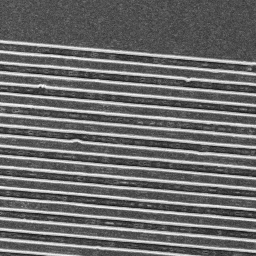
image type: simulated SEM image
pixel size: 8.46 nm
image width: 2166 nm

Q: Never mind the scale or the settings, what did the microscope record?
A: parallel lines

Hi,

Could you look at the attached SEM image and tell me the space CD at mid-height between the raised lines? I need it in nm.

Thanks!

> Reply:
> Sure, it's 75.8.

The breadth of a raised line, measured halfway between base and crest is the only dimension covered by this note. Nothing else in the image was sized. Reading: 11.8 px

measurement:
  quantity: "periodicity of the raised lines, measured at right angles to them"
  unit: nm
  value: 176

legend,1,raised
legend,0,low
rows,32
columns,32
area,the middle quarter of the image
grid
11111111111111111111111100000000
00000011111111111111111111111111
00000000000000000111111111111111
10000000000000000000000000000111
11111111111110000000000000000000
11111111111111111111111100000000
00011111111111111111111111111111
00000000000000011111111111111111
00000000000000000000000000111111
11111111110000000000000000000000
11111111111111111111100000000000
01111111111111111111111111111111
00000000001011111111111111111111
00000000000000000000000011111111
11111000000000000000000000000000
11111111111111110000000000000000
11111111111111111111111111100000
00000000001111111111111111111111
00000000000000000000011111111111
11111000000000000000000000000000
11111111111111100000000000000000
11111111111111111111111111110000
00000001111111111111111111111111
00000000000000000011111111111111
11000000000000000000000000000011
11111111111111000000000000000000
11111111111111111111111110000000
00001111111111111111111111111111
00000000000000011111111111111111
00000000000000000000000000011111
11111111111000000000000000000000
11111111111111111111110000000000